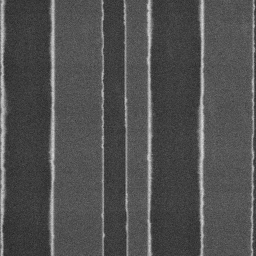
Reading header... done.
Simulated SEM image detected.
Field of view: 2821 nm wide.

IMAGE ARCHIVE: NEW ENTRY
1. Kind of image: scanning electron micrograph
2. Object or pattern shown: lines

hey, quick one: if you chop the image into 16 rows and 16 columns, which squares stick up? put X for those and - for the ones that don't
---XXXXXX----XXX
---XXXXXX----XXX
---XXXXXX----XXX
---XXXXXX----XXX
---XXXXXX----XXX
---XXXXXX----XXX
---XXXXXX----XXX
---XXXXXX----XXX
---XXXXXX----XXX
---XXXXXX----XXX
---XXXXXX----XXX
---XXXXXX----XXX
---XXXXXX----XXX
---XXXXXX----XXX
---XXXXXX----XXX
---XXXXXX----XXX